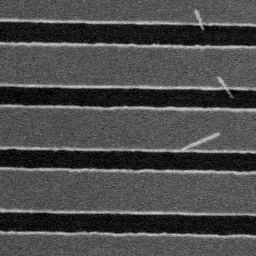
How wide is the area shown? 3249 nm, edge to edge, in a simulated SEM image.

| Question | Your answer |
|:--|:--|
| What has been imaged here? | lines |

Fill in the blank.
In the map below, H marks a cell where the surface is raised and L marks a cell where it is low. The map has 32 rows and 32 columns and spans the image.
HHHHHHHHHHHHHHHHHHHHHHHHHHHHHHHH
HHHHHHHHHHHHHHHHHHHHHHHHHHHHHHHH
HHHHHHHHHHHHHHHHHHHHHHHHHHHHHHHH
LLLLLLLLLLLLLLLLLLLLLLLLLLLLLLLL
LLLLLLLLLLLLLLLLLLLLLLLLLLLLLLLL
HHHHHHHHHHLLHLLLLLLLLLLLLLLLLLLL
HHHHHHHHHHHHHHHHHHHHHHHHHHHHHHHH
HHHHHHHHHHHHHHHHHHHHHHHHHHHHHHHH
HHHHHHHHHHHHHHHHHHHHHHHHHHHHHHHH
HHHHHHHHHHHHHHHHHHHHHHHHHHHHHHHH
HHHHHHHHHHHHHHHHHHHHHHHHHHHHHHHH
LLLLLLLLLLLLLLLLLLLLLLLLLLLLLLLL
LLLLLLLLLLLLLLLLLLLLLLLLLLLLLLLL
HHHHHHHHHHHHHLHHHHHLLHLLLLLLLLLL
HHHHHHHHHHHHHHHHHHHHHHHHHHHHHHHH
HHHHHHHHHHHHHHHHHHHHHHHHHHHHHHHH
HHHHHHHHHHHHHHHHHHHHHHHHHHHHHHHH
HHHHHHHHHHHHHHHHHHHHHHHHHHHHHHHH
HHHHHHHHHHHHHHHHHHHHHHHHHHHHHHHH
LLLLLLLLLLLLLLLLLLLLLLLLLLLLLLLL
LLLLLLLLLLLLLLLLLLLLLLLLLLLLLLLL
HHHHHHHHHHHHHHHHHHHHHHHHHHHHHHLH
HHHHHHHHHHHHHHHHHHHHHHHHHHHHHHHH
HHHHHHHHHHHHHHHHHHHHHHHHHHHHHHHH
HHHHHHHHHHHHHHHHHHHHHHHHHHHHHHHH
HHHHHHHHHHHHHHHHHHHHHHHHHHHHHHHH
LLLLLLHHHHHHHHHHHHHHHHHHHHHHHHHH
LLLLLLLLLLLLLLLLLLLLLLLLLLLLLLLL
LLLLLLLLLLLLLLLLLLLLLLLLLLLLLLLL
HHHHHHHHHHHHHHHHHHHHHHHHHHHHLHHH
HHHHHHHHHHHHHHHHHHHHHHHHHHHHHHHH
HHHHHHHHHHHHHHHHHHHHHHHHHHHHHHHH